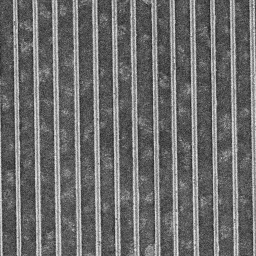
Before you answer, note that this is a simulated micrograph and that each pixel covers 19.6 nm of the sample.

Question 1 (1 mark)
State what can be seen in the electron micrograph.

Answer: parallel lines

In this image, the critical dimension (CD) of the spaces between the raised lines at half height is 0.311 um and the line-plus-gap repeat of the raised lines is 19.7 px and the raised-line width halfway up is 0.0735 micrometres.